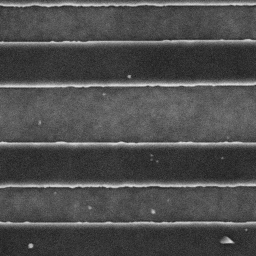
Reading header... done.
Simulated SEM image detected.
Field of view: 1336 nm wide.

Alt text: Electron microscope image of lines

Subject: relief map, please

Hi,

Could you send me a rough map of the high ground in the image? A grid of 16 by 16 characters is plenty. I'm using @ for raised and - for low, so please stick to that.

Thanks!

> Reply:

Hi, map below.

----------------
----------------
-------------@-@
@@@@@@@@@@@@@@@@
@@@@@@@@@@@@@@@@
----------------
----------------
----------------
----------------
@@@@@@@@@@@@@@@@
@@@@@@@@@@@@@@@@
@@@@@@@@@@@@@@@@
----------------
----------------
@@@@@@@@@@@@@@@@
@@@@@@@@@@@@@@@@